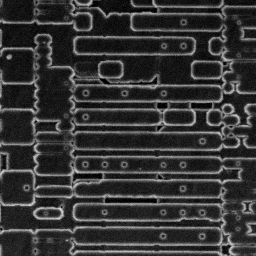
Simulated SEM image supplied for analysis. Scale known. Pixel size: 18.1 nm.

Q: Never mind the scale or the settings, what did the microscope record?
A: wiring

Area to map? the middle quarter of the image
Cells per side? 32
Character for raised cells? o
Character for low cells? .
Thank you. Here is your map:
.........oooooo.................
oo.......oooooo.................
oo.......oooooo.................
oo..............................
oo..............................
ooooooooooooooooooo....ooooooooo
oooooooooooooooooooooooooooooooo
ooooo.oooooooooooooooooooooooooo
oooooooooooooooooooooooooooooooo
oo..............................
oo..............................
oo.ooooooooooooooooooooo.ooooooo
oooooooooooooooooooooooooooooooo
ooooo.oooooooooooooooooooooooooo
oo.ooooooooooooooooooooo.ooooooo
oo..............................
oo..............................
oo.ooooooooooooooooooooooooooooo
oooooooooooooooooooooooooooooooo
oooooooooooooooooooooooooooooooo
oooooooooooooooooooooooooooooooo
oo..............................
oo..............................
oooooooooooooooooooooooooooooooo
oooooooooooooooooooooooooooooooo
oooooooooooooooooooooooooooooooo
oo.ooooooooooooooooooooooooooooo
oo..............................
................................
.........ooooooooooooooooooooooo
...ooooooooooooooooooooooooooooo
ooooooooooooooooooooooooooooo.oo